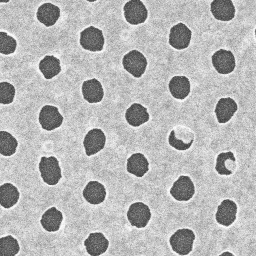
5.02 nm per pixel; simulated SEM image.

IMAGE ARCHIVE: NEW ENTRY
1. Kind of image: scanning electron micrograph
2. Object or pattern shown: a regular array of holes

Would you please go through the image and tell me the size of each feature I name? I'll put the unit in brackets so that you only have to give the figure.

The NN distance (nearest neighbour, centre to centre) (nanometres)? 247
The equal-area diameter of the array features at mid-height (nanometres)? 120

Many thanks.